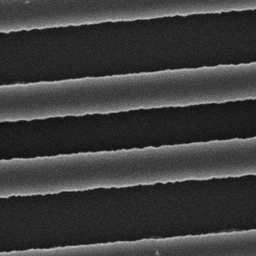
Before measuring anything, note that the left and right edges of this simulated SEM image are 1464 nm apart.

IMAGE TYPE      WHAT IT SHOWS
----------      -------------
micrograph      lines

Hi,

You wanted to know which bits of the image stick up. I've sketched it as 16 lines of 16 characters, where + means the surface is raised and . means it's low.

++++++++++++++++
++++++..........
................
................
.........+++++++
++++++++++++++++
+++++++++++++...
++..............
................
......++++++++++
++++++++++++++++
++++++++++......
................
................
...............+
....++++++++++++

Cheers